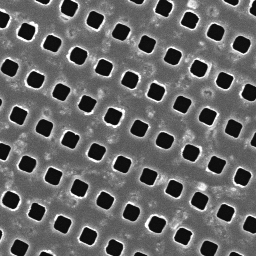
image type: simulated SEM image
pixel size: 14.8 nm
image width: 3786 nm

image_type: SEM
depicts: a regular array of holes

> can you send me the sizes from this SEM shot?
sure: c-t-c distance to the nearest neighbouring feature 422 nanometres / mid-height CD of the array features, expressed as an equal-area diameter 250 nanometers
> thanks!